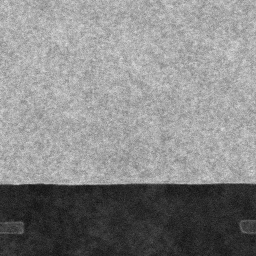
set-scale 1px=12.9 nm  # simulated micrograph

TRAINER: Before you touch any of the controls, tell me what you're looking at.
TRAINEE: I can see wiring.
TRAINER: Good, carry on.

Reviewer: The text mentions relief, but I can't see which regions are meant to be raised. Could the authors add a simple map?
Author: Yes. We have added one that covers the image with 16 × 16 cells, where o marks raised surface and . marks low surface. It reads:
oooooooooooooooo
oooooooooooooooo
oooooooooooooooo
oooooooooooooooo
oooooooooooooooo
oooooooooooooooo
oooooooooooooooo
oooooooooooooooo
oooooooooooooooo
oooooooooooooooo
oooooooooooooooo
................
................
................
o..............o
................